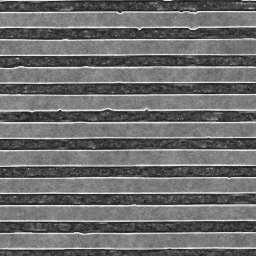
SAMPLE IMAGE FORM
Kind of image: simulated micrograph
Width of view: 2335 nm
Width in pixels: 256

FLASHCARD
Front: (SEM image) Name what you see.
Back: parallel lines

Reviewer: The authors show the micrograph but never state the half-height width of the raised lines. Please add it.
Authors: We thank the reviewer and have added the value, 0.139 microns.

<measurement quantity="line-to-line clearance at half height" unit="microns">0.108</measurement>